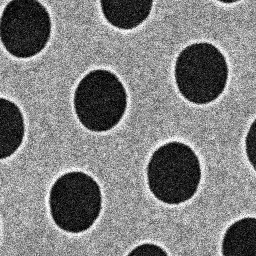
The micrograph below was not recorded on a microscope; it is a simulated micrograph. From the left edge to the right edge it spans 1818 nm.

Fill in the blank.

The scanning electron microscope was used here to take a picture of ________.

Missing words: holes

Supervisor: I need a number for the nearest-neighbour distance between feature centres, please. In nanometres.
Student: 732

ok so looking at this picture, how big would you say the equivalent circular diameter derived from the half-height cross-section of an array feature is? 0.41 microns